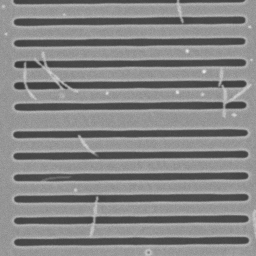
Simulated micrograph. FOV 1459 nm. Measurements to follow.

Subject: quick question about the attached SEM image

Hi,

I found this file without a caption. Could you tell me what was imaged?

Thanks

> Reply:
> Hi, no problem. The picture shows groups of lines, slits or small figures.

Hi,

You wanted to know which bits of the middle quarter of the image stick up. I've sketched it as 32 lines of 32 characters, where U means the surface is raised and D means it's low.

DDDDDDDDDDDDDDDDDDDDDDDDDDDDDDDD
UUUUUUUUUUUUUUUUUUUUUUUUUUUUUUUU
UUUUUUUUUUUUUUUUUUUUUUUUUUUUUUUU
UUUUUUUUUUUUUUUUUUUUUUUUUUUUUUUU
DDDDDDDDDDDDDDDDDDDDDDDDDDDDDDDD
UDDDDDDDDDDDDDDDDDDDDDDDDDDDDDDD
UUUUUUUUUUUUUUUUUUUUUUUUUUUUUUUU
UUUUUUUUUUUUUUUUUUUUUUUUUUUUUUUU
UUUUUUUUUUUUUUUUUUUUUUUUUUUUUUUU
UUUUUUUUUUUUUDDDDDDDDDDDDDDDDDDD
DDDDDDDDDDDDDDDDDDDDDDDDDDDDDDDD
DDDDDDDDDDDDDDDDDDDDUUUUUUUUUUUU
UUUUUUUUUUUUUUUUUUUUUUUUUUUUUUUU
UUUUUUUUUUUUUUUUUUUUUUUUUUUUUUUU
UUUUUUUUUUUUUUUUUUUUUUUUUUUUUUUU
UUUUUUUUUUUUUUUUUUUUUUUUUUUUUUUU
UUUUUDDDDDDDUUUDDDDDDDDDDDDDDDDD
DDDDDDDDDDDDDDDDDDDDDDDDDDDDDDDD
DDDUUDDDDDDDUUUUDDUUUUUUUUUUUUUU
UUUUUUUUUUUUUUUUUUUUUUUUUUUUUUUU
UUUUUUUUUUUUUUUUUUUUUUUUUUUUUUUU
UUUUUUUUUUUUUUUUUUUUUUUUUUUUUUUU
DDDDDDDDDDDDDDDDDDDDDDDDDDDDDDDD
DDDDDDDDDDDDDDDDDDDDDDDDDDDDDDDD
UUUUUUUUUUUUUUUUUUUUUUUUUUUUUUUU
UUUUUUUUUUUUUUUUUUUUUUUUUUUUUUUU
UUUUUUUUUUUUUUUUUUUUUUUUUUUUUUUU
DDDDDDDDDDDDDDDDDDDDDDDDDDDDDDDD
DDDDDDDDDDDDDDDDDDDDDDDDDDDDDDDD
UUUUUUUUUUUUUUUUUUUUUUUUUUUUUUUU
UUUUUUUUUUUUUUUUUUUUUUUUUUUUUUUU
UUUUUUUUUUUUUUUUUUUUUUUUUUUUUUUU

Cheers